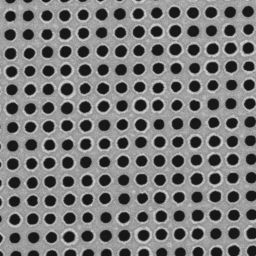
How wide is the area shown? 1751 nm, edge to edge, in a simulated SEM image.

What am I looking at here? a regular array of holes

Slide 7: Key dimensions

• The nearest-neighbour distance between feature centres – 0.122 µm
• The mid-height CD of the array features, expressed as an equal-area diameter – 76.8 nanometres